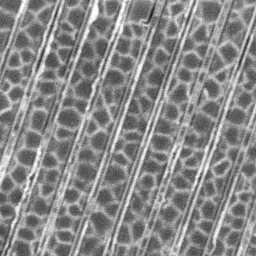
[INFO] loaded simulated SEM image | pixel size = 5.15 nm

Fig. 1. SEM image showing parallel lines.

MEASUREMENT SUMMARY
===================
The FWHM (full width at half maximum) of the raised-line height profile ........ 35.9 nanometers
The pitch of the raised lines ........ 0.163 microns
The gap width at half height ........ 127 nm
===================